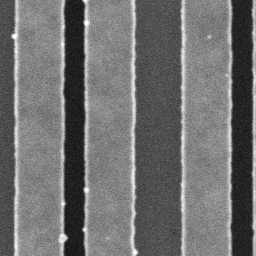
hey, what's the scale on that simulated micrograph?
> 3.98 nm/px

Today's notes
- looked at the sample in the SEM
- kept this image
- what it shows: lines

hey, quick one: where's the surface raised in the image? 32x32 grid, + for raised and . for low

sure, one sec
..++++++...++++++......++++++...
..++++++...++++++......++++++...
..++++++...++++++......++++++...
..++++++...++++++......++++++...
..++++++...++++++......++++++...
..++++++...++++++......++++++...
..++++++...++++++......++++++...
..++++++...++++++......++++++...
..++++++...++++++......++++++...
..++++++...++++++......++++++...
..++++++...++++++......++++++...
..++++++...++++++......++++++...
..++++++...++++++......++++++...
..++++++...++++++......++++++...
..++++++...++++++......++++++...
..++++++...++++++......++++++...
..++++++...++++++......++++++...
..++++++...++++++......++++++...
..++++++...++++++......++++++...
..++++++...++++++......++++++...
..++++++...++++++......++++++...
..++++++...++++++......++++++...
..++++++...++++++......++++++...
..++++++...++++++......++++++...
..++++++...++++++......++++++...
..++++++...++++++......++++++...
..++++++...++++++......++++++...
..++++++...++++++......++++++...
..++++++...++++++......++++++...
..++++++...++++++......++++++...
..++++++...++++++......++++++...
..++++++...++++++......++++++...